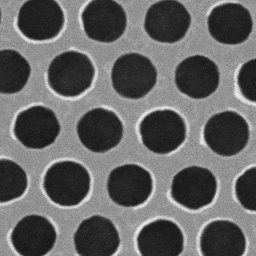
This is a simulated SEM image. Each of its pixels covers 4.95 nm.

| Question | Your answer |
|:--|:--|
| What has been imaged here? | a regular array of holes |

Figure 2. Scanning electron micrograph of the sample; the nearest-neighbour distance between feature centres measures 309 nm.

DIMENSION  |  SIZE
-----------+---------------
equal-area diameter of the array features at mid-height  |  220 nm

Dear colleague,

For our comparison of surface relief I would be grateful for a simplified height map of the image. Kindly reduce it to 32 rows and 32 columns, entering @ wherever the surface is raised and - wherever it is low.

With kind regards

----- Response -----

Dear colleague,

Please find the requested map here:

@@@----@@@@----@@@@----@@@@@--@@
@@------@@------@@-----@@@-----@
@@------@@------@@------@@-----@
@@------@@@-----@@------@@------
@@@----@@@@----@@@@----@@@@----@
@@@@@@@@@@@@@@@@@@@@@@@@@@@@--@@
--@@@@@@@-@@@@@@@@@@@@@@@@@@@@@@
---@@@@----@@@@----@@@@---@@@@@-
----@@------@@-----@@@-----@@@--
----@@------@@------@@-----@@@--
---@@@-----@@@-----@@@-----@@@--
--@@@@@---@@@@@----@@@@----@@@--
@@@@@@@@@@@@@@@@@@@@@@@@@@@@@@@-
@@@@-@@@@@@@@@@@@@@@@@@@@@@@@@@@
@@-----@@@-----@@@----@@@@@---@@
@@-----@@@-----@@@-----@@@-----@
@@-----@@@-----@@@-----@@@-----@
@@-----@@@-----@@@-----@@@-----@
@@@@-@@@@@@---@@@@----@@@@----@@
@@@@@@@@@@@@@@@@@@@@@@@@@@@@-@@@
--@@@@@---@@@@@@@@@@@@@@@@@@@@@@
---@@@-----@@@----@@@@----@@@@@-
---@@@-----@@@-----@@@-----@@@--
---@@@-----@@------@@------@@---
---@@@-----@@@-----@@@-----@@@--
@@@@@@@---@@@@@---@@@@@---@@@@--
@@@@@@@@@@@@@@@@@@@@@@@@@@@@@@@@
@@@---@@@@@---@@@@@@@@@@@@@@@@@@
@@-----@@@----@@@@----@@@@----@@
@------@@------@@------@@------@
@@-----@@------@@------@@------@
@@----@@@@----@@@@-----@@-----@@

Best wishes